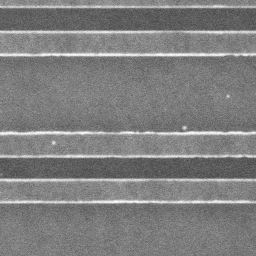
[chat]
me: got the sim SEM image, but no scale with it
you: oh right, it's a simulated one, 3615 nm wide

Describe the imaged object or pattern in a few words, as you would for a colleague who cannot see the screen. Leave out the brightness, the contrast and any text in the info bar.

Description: lines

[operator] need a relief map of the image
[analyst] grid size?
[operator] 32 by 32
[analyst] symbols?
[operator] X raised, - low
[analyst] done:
XXXXXXXXXXXXXXXXXXXXXXXXXXXXXXXX
--------------------------------
--------------------------------
--------------------------------
XXXXXXXXXXXXXXXXXXXXXXXXXXXXXXXX
XXXXXXXXXXXXXXXXXXXXXXXXXXXXXXXX
XXXXXXXXXXXXXXXXXXXXXXXXXXXXXXXX
--------------------------------
--------------------------------
--------------------------------
--------------------------------
--------------------------------
--------------------------------
--------------------------------
--------------------------------
--------------------------------
--------------------------------
XXXXXXXXXXXXXXXXXXXXXXXXXXXXXXXX
XXXXXXXXXXXXXXXXXXXXXXXXXXXXXXXX
XXXXXXXXXXXXXXXXXXXXXXXXXXXXXXXX
--------------------------------
--------------------------------
XXXXXXXXXXXXXXXXXXXXXXXXXXXXXXXX
XXXXXXXXXXXXXXXXXXXXXXXXXXXXXXXX
XXXXXXXXXXXXXXXXXXXXXXXXXXXXXXXX
--------------------------------
--------------------------------
--------------------------------
--------------------------------
--------------------------------
--------------------------------
--------------------------------